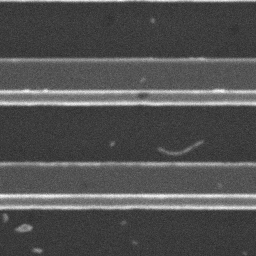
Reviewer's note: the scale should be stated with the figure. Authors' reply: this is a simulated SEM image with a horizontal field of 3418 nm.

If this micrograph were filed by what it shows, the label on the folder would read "lines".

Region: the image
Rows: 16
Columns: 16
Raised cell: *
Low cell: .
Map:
................
................
................
................
****************
****************
.*****...**....*
................
................
................
****************
****************
****************
................
................
................